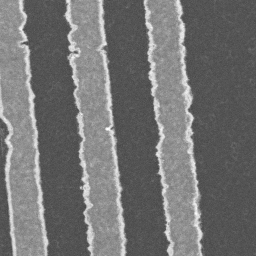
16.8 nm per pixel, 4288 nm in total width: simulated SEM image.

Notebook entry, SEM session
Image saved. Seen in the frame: one or a few lines or trenches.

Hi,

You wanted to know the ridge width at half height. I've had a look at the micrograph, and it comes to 32.1 px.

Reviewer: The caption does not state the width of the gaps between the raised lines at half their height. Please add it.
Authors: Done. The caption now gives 750 nm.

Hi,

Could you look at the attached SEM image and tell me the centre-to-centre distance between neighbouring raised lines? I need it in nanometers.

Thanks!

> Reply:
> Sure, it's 1290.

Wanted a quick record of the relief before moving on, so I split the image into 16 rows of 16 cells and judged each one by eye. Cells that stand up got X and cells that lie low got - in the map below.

X---XX---XX-----
X---XX---XX-----
XX--XX---XX-----
XX---X---XX-----
XX---XX--XXX----
XX---XX---XX----
XX---XX---XX----
XX---XX---XX----
-X---XX---XX----
-X---XX---XX----
XX---XX---XX----
XX---XX---XX----
-XX--XX---XX----
-XX--XXX--XX----
-XX---XX--XX----
-XX---XX---XX---